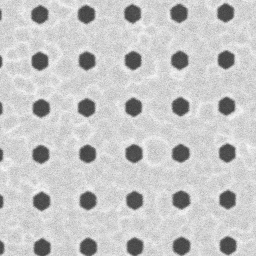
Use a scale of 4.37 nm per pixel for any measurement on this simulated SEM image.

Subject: a regular array of holes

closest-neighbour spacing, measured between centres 202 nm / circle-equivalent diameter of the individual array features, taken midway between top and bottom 79.9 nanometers